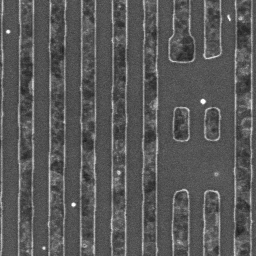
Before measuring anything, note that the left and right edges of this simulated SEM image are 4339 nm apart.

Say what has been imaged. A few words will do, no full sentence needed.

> wiring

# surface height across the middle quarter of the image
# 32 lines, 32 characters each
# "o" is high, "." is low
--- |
.....ooo....oooo....ooo.........
.....ooo....oooo....ooo.........
.....ooo....oooo....ooo.........
.....ooo....oooo....ooo.........
.....ooo....oooo....ooo.........
....oooo....oooo....ooo.........
....oooo....ooo.....ooo.........
.....ooo....ooo.....ooo.........
.....ooo....ooo.....ooo.........
.....ooo....ooo.....ooo.........
.....ooo....ooo.....ooo.........
.....ooo....ooo.....ooo.....ooo.
.....ooo....oooo....ooo.....ooo.
....oooo....oooo....ooo....oooo.
....oooo....oooo....ooo....oooo.
.....ooo....oooo....ooo....oooo.
.....ooo....ooo.....ooo....oooo.
.....ooo....ooo.....ooo....oooo.
.....ooo....ooo.....ooo....oooo.
.....oo.....ooo.....ooo.........
.....oo.....ooo.....ooo.........
.....oo.....ooo.....ooo.........
.....ooo....ooo.....ooo.........
.....ooo....ooo.....ooo.........
.....ooo....ooo.....ooo.........
.....oo.....ooo.....ooo.........
....ooo.....ooo.....ooo.........
....oooo....ooo.....ooo.........
....oooo....ooo.....ooo.........
....oooo....ooo.....ooo.........
....oooo....ooo.....ooo.........
....oooo....ooo.....ooo......oo.